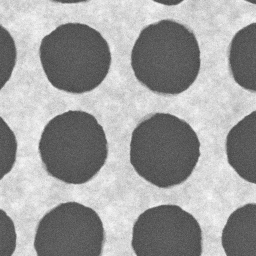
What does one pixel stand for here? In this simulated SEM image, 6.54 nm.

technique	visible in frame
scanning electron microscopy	holes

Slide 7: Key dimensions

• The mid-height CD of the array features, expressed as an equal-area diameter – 470 nm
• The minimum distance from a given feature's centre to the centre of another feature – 90.1 px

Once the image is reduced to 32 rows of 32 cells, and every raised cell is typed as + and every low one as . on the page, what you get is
++++++++++++++++++++..++++++++++
++++++++++++++++++++++++++++++++
++++++++++++++++++++..++++++++++
.++++++.....++++++......++++++..
.+++++.......++++.......+++++...
..+++........++++........++++...
..+++.........++.........++++...
..+++.........++.........++++...
..+++.........+++........++++...
.+++++.......++++........++++...
.+++++......++++++......++++++..
++++++++...++++++++....++++++++.
++++++++++++++++++++++++++++++++
++++++++++++++++++++++++++++++++
+++++++.....++++++....+++++++++.
.+++++......+++++.......++++++..
..+++........++++.......+++++...
..+++........+++.........+++....
..+++.........++.........+++....
..+++........+++.........+++....
..+++........+++.........++++...
.+++++......+++++.......++++++..
+++++++....+++++++.....++++++++.
++++++++++++++++++++.+++++++++++
++++++++++++++++++++++++++++++++
+++++++...+++++++++++++++++++++.
.+++++......++++++.....++++++...
.++++........++++.......++++....
..+++........++++........+++....
..++.........++++........+++....
..++.........+++.........+++....
..+++........++++........+++....